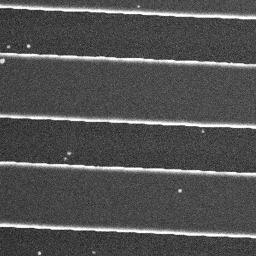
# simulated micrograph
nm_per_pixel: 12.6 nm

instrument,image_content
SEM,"lines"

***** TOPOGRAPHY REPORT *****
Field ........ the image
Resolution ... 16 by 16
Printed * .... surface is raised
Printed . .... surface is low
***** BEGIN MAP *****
.***************
................
................
****............
****************
****************
****************
....************
................
................
********........
****************
****************
****************
........********
................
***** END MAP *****